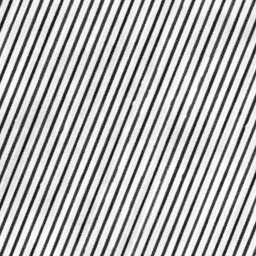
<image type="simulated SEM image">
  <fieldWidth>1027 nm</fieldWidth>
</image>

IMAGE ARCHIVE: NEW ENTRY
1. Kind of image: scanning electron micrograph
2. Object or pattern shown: parallel lines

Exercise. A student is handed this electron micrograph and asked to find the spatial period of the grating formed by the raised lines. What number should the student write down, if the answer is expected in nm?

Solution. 37.7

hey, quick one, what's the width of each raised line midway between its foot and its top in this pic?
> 0.0214 micrometres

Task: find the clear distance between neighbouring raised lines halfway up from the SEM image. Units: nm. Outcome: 14.4